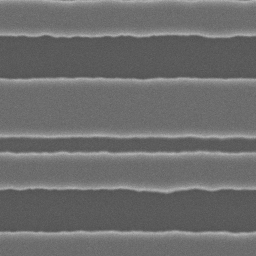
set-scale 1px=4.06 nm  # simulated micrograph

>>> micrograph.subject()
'lines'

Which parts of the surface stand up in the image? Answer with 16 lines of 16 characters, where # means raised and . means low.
################
################
................
................
................
################
################
################
################
################
################
################
................
................
.#....##..##....
################